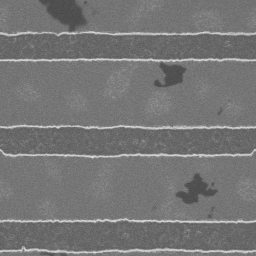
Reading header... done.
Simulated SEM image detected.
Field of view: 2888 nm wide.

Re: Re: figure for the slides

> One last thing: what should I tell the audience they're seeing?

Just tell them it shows one or a few lines or trenches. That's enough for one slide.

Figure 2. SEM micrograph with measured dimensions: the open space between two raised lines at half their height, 747 nanometers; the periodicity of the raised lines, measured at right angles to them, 1070 nanometers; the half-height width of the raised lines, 319 nanometres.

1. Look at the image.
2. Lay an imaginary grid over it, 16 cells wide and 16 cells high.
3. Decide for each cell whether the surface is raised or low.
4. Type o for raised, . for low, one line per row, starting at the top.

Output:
................
................
oooooooooooooooo
oooooooooooooooo
................
................
................
................
oooooooooooooooo
oooooooooooooooo
................
................
................
................
oooooooooooooooo
oooooooooooooooo